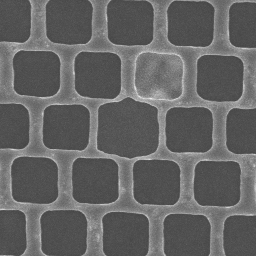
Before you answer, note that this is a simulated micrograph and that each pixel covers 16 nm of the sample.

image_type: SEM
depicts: a regular array of holes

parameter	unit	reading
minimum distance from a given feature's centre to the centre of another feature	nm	972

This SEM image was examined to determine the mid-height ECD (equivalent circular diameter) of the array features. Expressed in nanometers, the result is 817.